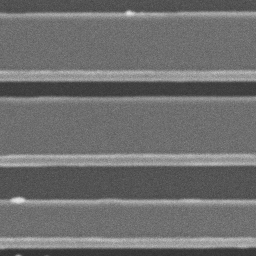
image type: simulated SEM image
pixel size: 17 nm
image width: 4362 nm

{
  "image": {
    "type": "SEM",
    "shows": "lines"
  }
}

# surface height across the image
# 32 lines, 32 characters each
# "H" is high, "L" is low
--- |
LLLLLLLLLLLLLLLLLLLLLLLLLLLLLLLL
LLLLLLLLLLLLLLLLHLLLLLLLLLLLLLLL
HHHHHHHHHHHHHHHHHHHHHHHHHHHHHHHH
HHHHHHHHHHHHHHHHHHHHHHHHHHHHHHHH
HHHHHHHHHHHHHHHHHHHHHHHHHHHHHHHH
HHHHHHHHHHHHHHHHHHHHHHHHHHHHHHHH
HHHHHHHHHHHHHHHHHHHHHHHHHHHHHHHH
HHHHHHHHHHHHHHHHHHHHHHHHHHHHHHHH
HHHHHHHHHHHHHHHHHHHHHHHHHHHHHHHH
HHHHHHHHHHHHHHHHHHHHHHHHHHHHHHHH
LLLLLLLLLLLLLLLLLLLLLLLLLLLLLLLL
LLLLLLLLLLLLLLLLLLLLLLLLLLLLLLLL
HHHHHHHHHHHHHHHHHHHHHHHHHHHHHHHH
HHHHHHHHHHHHHHHHHHHHHHHHHHHHHHHH
HHHHHHHHHHHHHHHHHHHHHHHHHHHHHHHH
HHHHHHHHHHHHHHHHHHHHHHHHHHHHHHHH
HHHHHHHHHHHHHHHHHHHHHHHHHHHHHHHH
HHHHHHHHHHHHHHHHHHHHHHHHHHHHHHHH
HHHHHHHHHHHHHHHHHHHHHHHHHHHHHHHH
HHHHHHHHHHHHHHHHHHHHHHHHHHHHHHHH
HHHHHHHHHHHHHHHHHHHHHHHHHHHLLLLL
LLLLLLLLLLLLLLLLLLLLLLLLLLLLLLLL
LLLLLLLLLLLLLLLLLLLLLLLLLLLLLLLL
LLLLLLLLLLLLLLLLLLLLLLLLLLLLLLLL
LLLLLLLLLLLLLLLLLLLLLLLLLLLLLLLL
HHHHHHHHHHHHHHHHHHHHHHHHHHHHHHHH
HHHHHHHHHHHHHHHHHHHHHHHHHHHHHHHH
HHHHHHHHHHHHHHHHHHHHHHHHHHHHHHHH
HHHHHHHHHHHHHHHHHHHHHHHHHHHHHHHH
HHHHHHHHHHHHHHHHHHHHHHHHHHHHHHHH
HHHHHHHHHHHHHHHHHHHHHHHHHHHHHHHH
LLLLLLLLLLLLLLLLLLLLLLLLLLLLLLLL